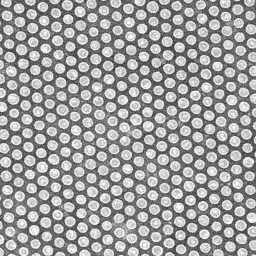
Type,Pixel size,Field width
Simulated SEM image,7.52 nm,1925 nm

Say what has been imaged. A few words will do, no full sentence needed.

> a regular array of raised bodies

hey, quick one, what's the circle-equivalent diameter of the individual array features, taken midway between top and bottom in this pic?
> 72.5 nm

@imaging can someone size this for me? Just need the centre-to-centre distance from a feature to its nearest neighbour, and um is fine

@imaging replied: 0.102